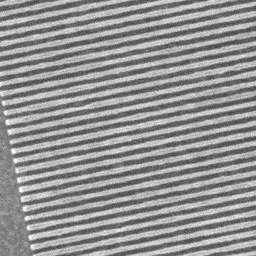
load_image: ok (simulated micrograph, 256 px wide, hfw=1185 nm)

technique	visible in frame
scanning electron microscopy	parallel lines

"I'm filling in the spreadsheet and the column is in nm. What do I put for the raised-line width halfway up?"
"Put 20.5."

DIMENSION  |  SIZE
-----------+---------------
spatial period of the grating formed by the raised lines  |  45.3 nm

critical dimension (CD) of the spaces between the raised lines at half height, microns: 0.0284